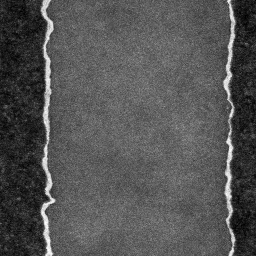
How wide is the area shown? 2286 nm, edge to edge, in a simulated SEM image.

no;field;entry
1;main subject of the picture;one or a few lines or trenches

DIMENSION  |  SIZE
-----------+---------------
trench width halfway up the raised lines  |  1620 nm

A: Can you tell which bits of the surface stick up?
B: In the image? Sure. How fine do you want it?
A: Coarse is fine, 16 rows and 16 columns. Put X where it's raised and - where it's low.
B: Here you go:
XXX-----------XX
XXX-----------XX
XXX-----------XX
XXX-----------XX
XXX-----------XX
XXX-----------XX
XXX-----------XX
XXX-----------XX
XXX-----------XX
XXX-----------XX
XXX-----------XX
XXX-----------XX
XXX-----------XX
XXX-----------XX
XXX-----------XX
XXX-----------XX